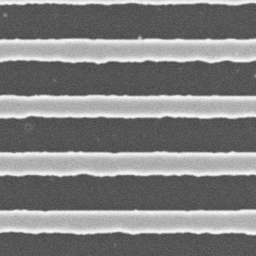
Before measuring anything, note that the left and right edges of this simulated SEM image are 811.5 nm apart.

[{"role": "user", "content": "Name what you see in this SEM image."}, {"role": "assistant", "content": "lines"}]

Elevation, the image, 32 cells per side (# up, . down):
###.....###.##....####.....###..
................................
................................
................................
................................
################################
################################
##.#############################
................................
................................
................................
................................
################################
################################
################################
................................
................................
................................
................................
################################
################################
################################
................................
................................
................................
................................
################################
################################
################################
................................
................................
................................